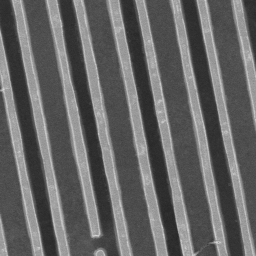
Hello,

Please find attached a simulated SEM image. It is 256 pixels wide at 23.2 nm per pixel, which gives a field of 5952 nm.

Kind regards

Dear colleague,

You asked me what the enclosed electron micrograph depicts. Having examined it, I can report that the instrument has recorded parallel lines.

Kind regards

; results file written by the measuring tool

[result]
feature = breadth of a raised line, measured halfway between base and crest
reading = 234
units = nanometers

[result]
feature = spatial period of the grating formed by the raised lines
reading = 698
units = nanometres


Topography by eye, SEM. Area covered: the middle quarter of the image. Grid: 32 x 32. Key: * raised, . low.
*....***......***....**.......**
*.....**.......**....**.......**
**....**.......**....***......**
**....***......**.....**......**
**....***......***....**.......*
**....***......***....**.......*
**....***.......**....**.......*
***....**.......**....***......*
***....**.......**....***......*
.**....***......***....**.......
.**....***......***....**.......
.**....***......***....***......
.***....**......***....***......
.***....**.......**....***......
.***....**.......***....**......
..**....***......***....**......
..**....***......***....**......
..***....**......***....***.....
..***....**.......**....***.....
..***....**.......***...***.....
..***....***......***....**.....
...**....***......***....**.....
...***....**......***....**.....
...***....**.......**....**.....
...***....**.......**.....**....
....**....***......**.....**....
....**....***......***....**....
....***...***......***....**....
....***....**.......**....***...
....***....**.......**....***...
....***....**.......***....**...
.....**....***......***....**...